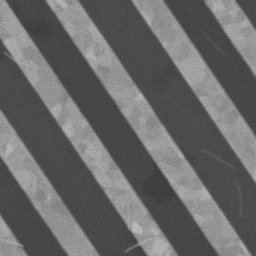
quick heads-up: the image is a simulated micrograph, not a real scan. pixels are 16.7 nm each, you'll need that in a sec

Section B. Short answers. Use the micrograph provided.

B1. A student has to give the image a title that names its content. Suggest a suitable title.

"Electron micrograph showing lines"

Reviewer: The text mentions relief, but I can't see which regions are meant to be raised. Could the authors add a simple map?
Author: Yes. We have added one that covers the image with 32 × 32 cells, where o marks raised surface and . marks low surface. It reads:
o.....oooo.......oooo.....oooo..
oo.....oooo.......ooo......ooo..
oo.....oooo.......oooo.....oooo.
ooo.....oooo.......oooo.....oooo
oooo.....oooo.......ooo......ooo
.ooo.....oooo.......oooo.....ooo
.oooo.....oooo.......oooo.....oo
..oooo.....oooo.......ooo......o
...ooo......ooo.......oooo.....o
...oooo.....oooo.......oooo.....
....oooo.....oooo.......ooo.....
.....ooo......ooo.......oooo....
.....oooo.....oooo.......oooo...
......oooo.....oooo.......ooo...
.......ooo......ooo.......oooo..
o......oooo.....oooo.......oooo.
oo......oooo.....oooo.......ooo.
oo.......ooo......ooo.......oooo
ooo......oooo.....oooo.......ooo
oooo......oooo.....oooo.......oo
.ooo.......ooo......oooo......oo
.oooo.......ooo.....oooo.......o
..oooo......oooo.....oooo.......
...ooo.......ooo......oooo......
....ooo.......ooo.....oooo......
....oooo......oooo.....oooo.....
.....oooo......ooo......oooo....
......ooo.......ooo.....oooo....
o.....oooo......oooo.....oooo...
oo.....oooo......ooo......oooo..
oo......ooo......oooo.....oooo..
ooo.....oooo......oooo.....oooo.